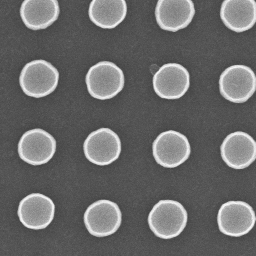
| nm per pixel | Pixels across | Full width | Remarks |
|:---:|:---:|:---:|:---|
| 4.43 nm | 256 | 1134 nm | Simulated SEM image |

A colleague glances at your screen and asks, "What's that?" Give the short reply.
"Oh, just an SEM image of a regular array of raised bodies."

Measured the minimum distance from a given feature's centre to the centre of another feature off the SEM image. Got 0.291 µm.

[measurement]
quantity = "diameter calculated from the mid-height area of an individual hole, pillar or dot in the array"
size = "0.154 microns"